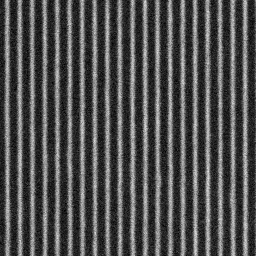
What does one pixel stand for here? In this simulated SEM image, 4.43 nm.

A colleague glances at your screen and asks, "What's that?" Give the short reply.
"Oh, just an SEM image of parallel lines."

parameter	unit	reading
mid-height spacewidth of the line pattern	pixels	9.62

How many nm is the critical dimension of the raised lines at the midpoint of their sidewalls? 11.6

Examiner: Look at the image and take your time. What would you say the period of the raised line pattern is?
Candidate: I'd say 0.0555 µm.